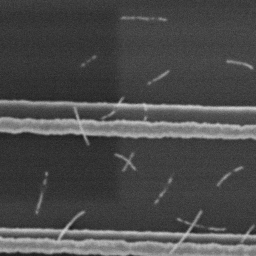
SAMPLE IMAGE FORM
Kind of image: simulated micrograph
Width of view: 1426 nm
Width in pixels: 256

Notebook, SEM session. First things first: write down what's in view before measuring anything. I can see lines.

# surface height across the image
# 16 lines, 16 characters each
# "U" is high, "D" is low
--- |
DDDDDDDDDDDDDDDD
DDDDDDDDDDDDDDDD
DDDDDDDDDDDDDDDD
DDDDDDDDDDDDDDDD
DDDDDDDDDDDDDDDD
DDDDDDDDDDDDDDDD
UUUUUUUUUDDDDDDD
UUUUUUUUUUUUUUUU
DDDDDDDUUUUUUUUU
DDDDDDDDDDDDDDDD
DDDDDDDDDDDDDDDD
DDDDDDDDDDDDDDDD
DDDDDDDDDDDDDDDD
DDDDDDDDDDDDDDDD
UUUUUUUUUDDDDDDD
UUUUUUUUUUUUUUUU